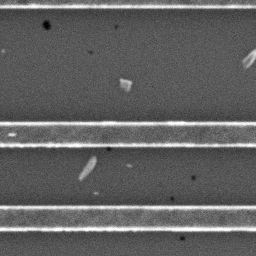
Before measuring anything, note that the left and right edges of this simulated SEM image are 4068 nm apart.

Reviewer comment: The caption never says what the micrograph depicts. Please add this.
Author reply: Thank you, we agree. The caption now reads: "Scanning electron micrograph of lines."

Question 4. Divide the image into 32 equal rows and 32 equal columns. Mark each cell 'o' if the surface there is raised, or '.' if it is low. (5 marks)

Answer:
oooooooooooooooooooooooooooooooo
................................
................................
................................
................................
................................
................................
................................
................................
................................
................................
................................
................................
................................
................................
oooooooooooooooooooooooooooooooo
oooooooooooooooooooooooooooooooo
oooooooooooooooooooooooooooooooo
................................
................................
................................
................................
................................
................................
................................
................................
oooooooooooooooooooooooooooooooo
oooooooooooooooooooooooooooooooo
oooooooooooooooooooooooooooooooo
................................
................................
................................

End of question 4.